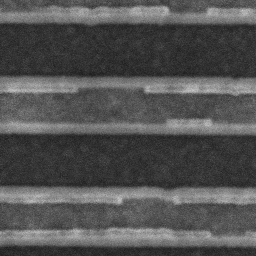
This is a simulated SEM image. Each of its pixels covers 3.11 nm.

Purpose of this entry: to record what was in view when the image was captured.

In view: one or a few lines or trenches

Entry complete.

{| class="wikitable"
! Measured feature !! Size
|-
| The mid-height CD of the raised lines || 0.147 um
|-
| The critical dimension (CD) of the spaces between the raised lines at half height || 197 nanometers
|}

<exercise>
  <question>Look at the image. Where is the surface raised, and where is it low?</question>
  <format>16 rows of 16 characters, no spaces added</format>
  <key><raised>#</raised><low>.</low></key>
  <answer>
################
................
................
................
................
################
################
################
................
................
................
................
################
################
################
................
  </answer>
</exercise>